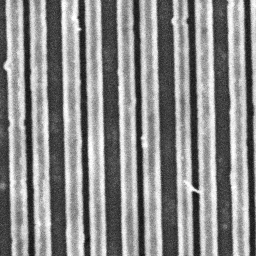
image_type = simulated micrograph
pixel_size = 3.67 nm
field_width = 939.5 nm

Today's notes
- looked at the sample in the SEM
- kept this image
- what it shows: parallel lines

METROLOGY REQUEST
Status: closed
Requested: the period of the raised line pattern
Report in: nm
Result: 102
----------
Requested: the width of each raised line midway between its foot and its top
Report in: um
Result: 0.0472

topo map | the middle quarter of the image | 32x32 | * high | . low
***...***.....***...***.....***.
***...***.....***...***.....***.
****..***.....***...***.....***.
***...***.....***...***.....***.
****..***.....***...***.....***.
***...***.....***...***.....***.
***...***.....***...***.....***.
***...***.....***...***.....***.
***...***.....***...***.....***.
***...***.....****..***.....***.
***...***.....***...***......**.
***...***.....***...***.....***.
.***..***.....***...***.....***.
.***..***.....***...***......**.
.***...**.....***...***......**.
.***...**.....***...***.....***.
.***...**......**...***......**.
.***...**......***..***......**.
.***...**......***..***......**.
.***...**......***..***.....***.
.***...**......***..***.....***.
.***...**......***..***......**.
.***...**......***..***......**.
.***...**......***..***......**.
.***...**......***..***......**.
.***...***.....**...***......**.
.***...***.....***..***......**.
.***...***.....***..***......**.
.***...***.....***..***......**.
.***...***.....***..***......**.
.***...***.....***...***.....***
.***...***.....***...***.....***